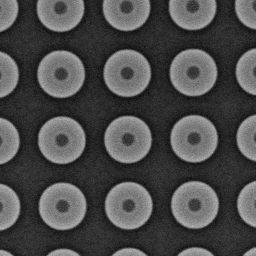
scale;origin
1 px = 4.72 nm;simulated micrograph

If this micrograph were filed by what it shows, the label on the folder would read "an array of small figures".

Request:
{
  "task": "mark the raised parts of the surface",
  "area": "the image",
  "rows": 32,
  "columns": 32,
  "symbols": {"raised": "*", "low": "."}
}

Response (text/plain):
**...*****...******..******..***
**...*****...******..******...**
**...*****...*****....****....**
*.....***.....***......**......*
................................
................................
.......**......**......***.....*
**...*****....****....*****...**
**...*****...******..******...**
**...******..******..******...**
**...*****...*****....*****...**
*.....****....****.....***.....*
................................
................................
........................*......*
*.....****....****....*****...**
**...*****...******..******...**
**...******..******..******...**
**...******..******...*****...**
**....****....****....****.....*
................................
................................
................................
*.....****....****....****....**
**...*****...******...*****...**
**...******..******..******...**
**...******..******...*****...**
**...*****....****....*****...**
*......**......**.......*.......
................................
................................
*.....***......***.....***.....*